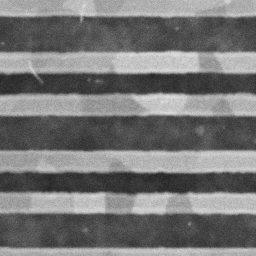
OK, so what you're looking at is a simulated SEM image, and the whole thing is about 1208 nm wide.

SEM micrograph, lines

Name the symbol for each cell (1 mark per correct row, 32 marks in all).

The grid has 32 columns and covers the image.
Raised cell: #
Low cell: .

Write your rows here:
################################
################################
................................
................................
................................
................................
................................
################################
################################
................................
................................
................................
################################
################################
................................
................................
................................
................................
................................
################################
################################
....................#..#........
................................
................................
################################
################################
################################
................................
................................
................................
................................
################################